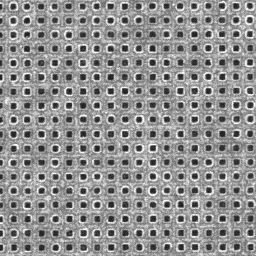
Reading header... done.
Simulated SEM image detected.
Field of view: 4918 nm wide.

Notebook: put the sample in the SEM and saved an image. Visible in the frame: a regular array of holes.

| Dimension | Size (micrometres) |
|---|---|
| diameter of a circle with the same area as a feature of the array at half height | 0.139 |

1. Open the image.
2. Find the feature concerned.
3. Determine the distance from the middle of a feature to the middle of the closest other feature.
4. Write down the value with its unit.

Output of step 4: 13.6 px